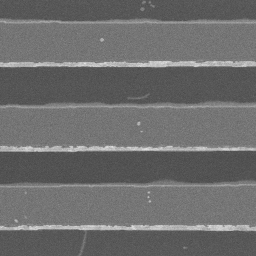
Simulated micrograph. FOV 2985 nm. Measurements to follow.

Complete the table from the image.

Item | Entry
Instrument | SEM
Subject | lines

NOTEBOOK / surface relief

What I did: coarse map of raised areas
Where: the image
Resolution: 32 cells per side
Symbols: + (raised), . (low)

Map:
................................
................................
................................
++++++++++++++++++++++++++++++++
++++++++++++++++++++++++++++++++
++++++++++++++++++++++++++++++++
++++++++++++++++++++++++++++++++
++++++++++++++++++++++++++++++++
................................
................................
................................
................................
................................
++++++++++++++++++++++++++++++++
++++++++++++++++++++++++++++++++
++++++++++++++++++++++++++++++++
++++++++++++++++++++++++++++++++
++++++++++++++++++++++++++++++++
++++++++++++++++++++++++++++++++
................................
................................
................................
................................
++++++++++++++++++++++++++++++++
++++++++++++++++++++++++++++++++
++++++++++++++++++++++++++++++++
++++++++++++++++++++++++++++++++
++++++++++++++++++++++++++++++++
++++++++++++++++++++++++++++++++
................................
................................
................................